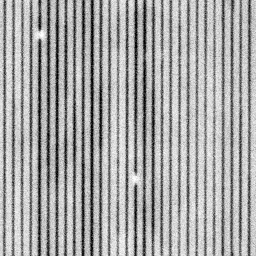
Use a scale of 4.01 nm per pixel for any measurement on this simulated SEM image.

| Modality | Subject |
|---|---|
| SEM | parallel lines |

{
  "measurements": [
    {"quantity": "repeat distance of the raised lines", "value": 35.1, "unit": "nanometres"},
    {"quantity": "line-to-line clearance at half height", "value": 0.008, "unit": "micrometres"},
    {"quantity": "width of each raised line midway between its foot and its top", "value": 6.76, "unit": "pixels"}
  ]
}